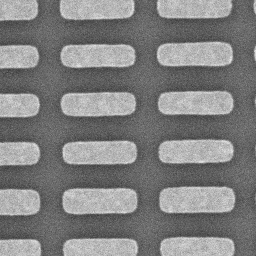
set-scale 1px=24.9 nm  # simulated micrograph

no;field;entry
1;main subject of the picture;wiring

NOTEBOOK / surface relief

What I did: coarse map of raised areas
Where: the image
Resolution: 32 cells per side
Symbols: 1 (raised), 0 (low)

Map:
11111000111111111000111111111000
11111000111111111000111111111000
00000000000000000000000000000000
00000000000000000000000000000000
00000000000000000000000000000000
00000000000000000000011111110000
11111000111111111000111111111000
11111000111111111000111111111000
00000000000000000000000000000000
00000000000000000000000000000000
00000000000000000000000000000000
00000000000000000000000000110000
11111000111111111000111111111000
11111000111111111000111111111000
00000000000000000000000000000000
00000000000000000000000000000000
00000000000000000000000000000000
00000000000000000000000000000000
11111000111111111000111111111000
11111000111111111000111111111000
11110000000000000000000000000000
00000000000000000000000000000000
00000000000000000000000000000000
00000000000000000000000000000000
11111000111111111000111111111000
11111000111111111000111111111000
11110000111111110000011110000000
00000000000000000000000000000000
00000000000000000000000000000000
00000000000000000000000000000000
11111000111111111000111111111000
11111000111111111000111111111000